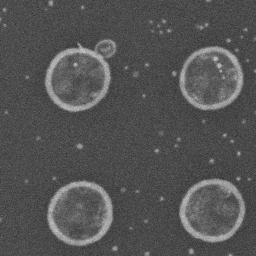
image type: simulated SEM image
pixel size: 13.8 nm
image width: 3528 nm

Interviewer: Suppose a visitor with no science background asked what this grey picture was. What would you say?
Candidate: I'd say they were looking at raised bodies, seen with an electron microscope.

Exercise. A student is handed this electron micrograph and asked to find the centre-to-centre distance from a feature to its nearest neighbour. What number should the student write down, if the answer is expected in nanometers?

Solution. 1820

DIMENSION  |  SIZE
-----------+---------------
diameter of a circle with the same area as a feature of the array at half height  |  823 nm